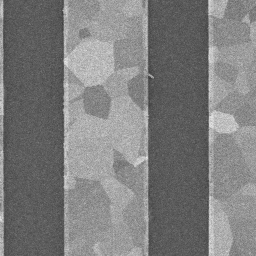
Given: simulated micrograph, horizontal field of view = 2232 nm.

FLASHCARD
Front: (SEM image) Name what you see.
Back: one or a few lines or trenches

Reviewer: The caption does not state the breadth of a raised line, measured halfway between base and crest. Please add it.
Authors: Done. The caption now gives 717 nanometres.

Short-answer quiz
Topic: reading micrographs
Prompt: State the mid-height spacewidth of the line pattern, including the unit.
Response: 540 nm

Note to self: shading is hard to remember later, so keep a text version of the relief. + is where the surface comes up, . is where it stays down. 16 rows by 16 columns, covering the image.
....+++++....+++
....+++++....+++
....+++++....+++
....+++++....+++
....+++++....+++
....+++++....+++
....+++++....+++
....+++++....+++
....+++++....+++
....+++++....+++
....+++++....+++
....+++++....+++
....+++++....+++
....+++++....+++
....+++++....+++
....+++++....+++